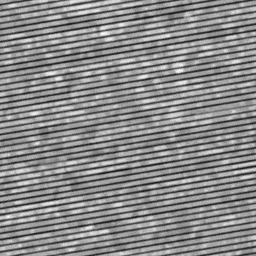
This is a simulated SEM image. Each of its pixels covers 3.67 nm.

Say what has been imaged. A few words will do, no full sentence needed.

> parallel lines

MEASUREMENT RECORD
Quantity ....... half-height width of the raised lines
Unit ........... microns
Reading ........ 0.0163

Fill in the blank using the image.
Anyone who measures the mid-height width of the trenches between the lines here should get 6.8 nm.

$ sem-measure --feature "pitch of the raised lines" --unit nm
22.4